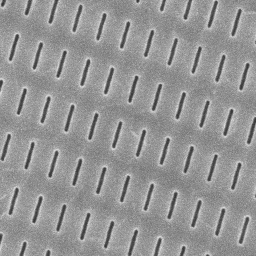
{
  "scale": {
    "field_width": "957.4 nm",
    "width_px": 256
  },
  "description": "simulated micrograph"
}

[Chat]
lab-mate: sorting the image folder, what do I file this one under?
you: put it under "a regular array of holes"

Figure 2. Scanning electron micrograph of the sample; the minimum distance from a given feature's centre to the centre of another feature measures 94.2 nanometres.